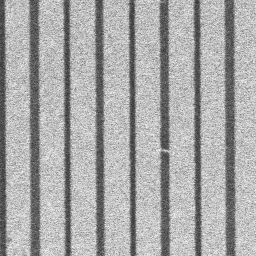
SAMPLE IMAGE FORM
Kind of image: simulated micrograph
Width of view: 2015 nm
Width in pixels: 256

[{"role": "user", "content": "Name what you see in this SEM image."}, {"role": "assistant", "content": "parallel lines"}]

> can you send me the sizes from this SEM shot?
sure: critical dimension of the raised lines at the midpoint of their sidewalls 0.197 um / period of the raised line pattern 256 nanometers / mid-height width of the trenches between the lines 61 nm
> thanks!